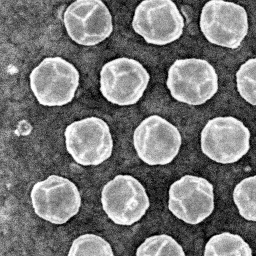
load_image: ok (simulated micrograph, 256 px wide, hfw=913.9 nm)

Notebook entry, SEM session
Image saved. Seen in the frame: a regular array of raised bodies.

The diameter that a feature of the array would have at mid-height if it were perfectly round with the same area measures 165 nanometers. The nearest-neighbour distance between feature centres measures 0.239 microns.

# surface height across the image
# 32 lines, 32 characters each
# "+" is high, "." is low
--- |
.........++++.....++++....+++...
........++++++...+++++...++++++.
........++++++...++++++..++++++.
........++++++...++++++..++++++.
.........++++.....++++....+++++.
..........+................+++..
................................
......+........+.......++.......
.....++++....+++++...+++++....++
....++++++...+++++...++++++...++
....++++++...+++++...++++++...++
....+++++....+++++....+++++...++
.....++++.....+++......+++.....+
................................
................................
.........++++.....+++.....++++..
........++++++...+++++...++++++.
........++++++...++++++..++++++.
........++++++...+++++...++++++.
.........+++++....++++....++++..
................................
................................
......++......+++.....++++.....+
....+++++....+++++...+++++...+++
....++++++...+++++...++++++..+++
....++++++...++++++..++++++...++
.....+++++...+++++....++++....++
......+++.....+++......++......+
................................
..........++........+......+++..
.........++++.....++++....+++++.
.........+++++...++++++...+++++.